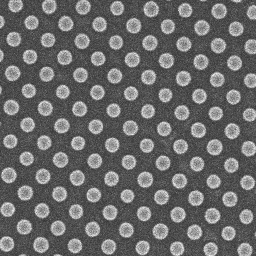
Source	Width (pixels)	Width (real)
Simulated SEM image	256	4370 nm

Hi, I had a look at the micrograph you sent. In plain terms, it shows a regular array of raised bodies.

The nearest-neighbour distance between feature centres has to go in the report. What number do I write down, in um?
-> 0.407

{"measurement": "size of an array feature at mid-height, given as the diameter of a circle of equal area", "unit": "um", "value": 0.246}